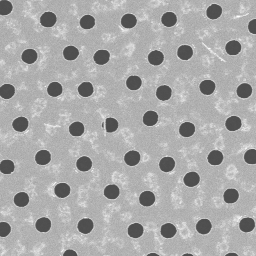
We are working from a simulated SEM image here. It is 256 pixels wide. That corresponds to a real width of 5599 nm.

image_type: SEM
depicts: a regular array of holes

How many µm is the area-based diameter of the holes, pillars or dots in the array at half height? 0.346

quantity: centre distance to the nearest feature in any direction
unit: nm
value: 753